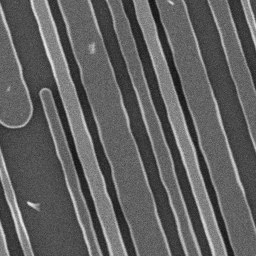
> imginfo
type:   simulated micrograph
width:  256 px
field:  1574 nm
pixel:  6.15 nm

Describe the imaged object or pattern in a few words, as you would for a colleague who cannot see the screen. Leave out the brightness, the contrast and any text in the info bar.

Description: groups of lines, slits or small figures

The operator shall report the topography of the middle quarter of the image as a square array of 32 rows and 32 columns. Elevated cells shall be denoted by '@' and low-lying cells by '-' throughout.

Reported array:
@---@@@@@@@@----@@@---@@@@--@@@@
@---@@@@@@@@----@@@@---@@@--@@@@
@---@@@@@@@@----@@@@---@@@---@@@
@@--@@@@@@@@@----@@@---@@@@--@@@
@@--@@@@@@@@@----@@@----@@@--@@@
@@---@@@@@@@@@---@@@@---@@@--@@@
@@@--@@@@@@@@@----@@@---@@@@--@@
@@@---@@@@@@@@----@@@---@@@@--@@
@@@---@@@@@@@@-----@@@---@@@--@@
@@@@--@@@@@@@@-----@@@---@@@@--@
@@@@---@@@@@@@@----@@@---@@@@--@
@@@@---@@@@@@@@----@@@@---@@@--@
-@@@---@@@@@@@@@----@@@---@@@@--
-@@@@---@@@@@@@@----@@@@--@@@@--
-@@@@---@@@@@@@@----@@@@---@@@--
--@@@----@@@@@@@-----@@@---@@@--
--@@@@---@@@@@@@@----@@@---@@@@-
--@@@@---@@@@@@@@----@@@@---@@@-
--@@@@@--@@@@@@@@-----@@@---@@@-
@--@@@@--@@@@@@@@@----@@@---@@@@
@--@@@@---@@@@@@@@----@@@@---@@@
@--@@@@---@@@@@@@@----@@@@---@@@
@@-@@@@@--@@@@@@@@@----@@@---@@@
@@--@@@@---@@@@@@@@----@@@@---@@
@@--@@@@----@@@@@@@----@@@@---@@
@@--@@@@@---@@@@@@@@----@@@---@@
@@@--@@@@---@@@@@@@@----@@@----@
@@@--@@@@---@@@@@@@@----@@@@---@
@@@---@@@@--@@@@@@@@@---@@@@---@
-@@@--@@@@---@@@@@@@@----@@@----
-@@@--@@@@---@@@@@@@@----@@@@---
-@@@---@@@---@@@@@@@@@----@@@---